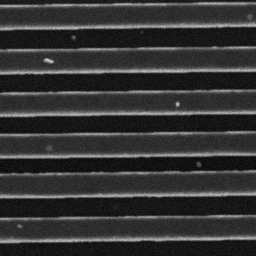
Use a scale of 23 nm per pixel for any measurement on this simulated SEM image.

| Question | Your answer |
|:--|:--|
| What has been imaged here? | lines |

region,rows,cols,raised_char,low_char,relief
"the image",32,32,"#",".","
..............##################
################################
################################
#################...............
................................
................................
################################
################################
################################
................................
................................
................################
################################
################################
####............................
................................
............................####
################################
################################
##########################......
................................
....................###.########
################################
################################
#################...............
................................
................................
################################
################################
################################
................................
................................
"